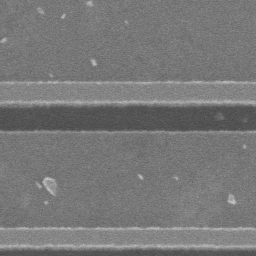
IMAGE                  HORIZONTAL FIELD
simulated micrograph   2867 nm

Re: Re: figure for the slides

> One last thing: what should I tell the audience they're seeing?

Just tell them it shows lines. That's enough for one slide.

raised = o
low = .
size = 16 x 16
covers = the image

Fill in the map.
oooooooooooooooo
oooooooooooooooo
oooooooooooooooo
oooooooooooooooo
oooooooooooooooo
oooooooooooooooo
................
................
oooooooooooooooo
oooooooooooooooo
oooooooooooooooo
oooooooooooooooo
oooooooooooooooo
oooooooooooooooo
oooooooooooooooo
..........o.....